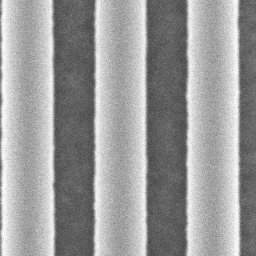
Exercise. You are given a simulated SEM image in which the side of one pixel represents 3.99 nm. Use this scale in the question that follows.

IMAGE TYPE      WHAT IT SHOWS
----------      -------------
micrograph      lines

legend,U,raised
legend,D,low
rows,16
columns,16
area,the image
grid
UUUDDDUUUDDDUUUD
UUUDDDUUUDDDUUUD
UUUDDDUUUDDDUUUD
UUUDDDUUUDDDUUUD
UUUDDDUUUDDDUUUD
UUUDDDUUUDDDUUUD
UUUDDDUUUDDDUUUD
UUUDDDUUUDDDUUUD
UUUDDDUUUDDDUUUD
UUUDDDUUUDDDUUUD
UUUDDDUUUDDDUUUD
UUUDDDUUUDDDUUUD
UUUDDDUUUDDDUUUD
UUUDDDUUUDDDUUUD
UUUDDDUUUDDDUUUD
UUUDDDUUUDDDUUUD